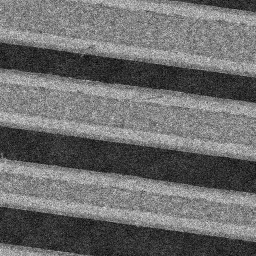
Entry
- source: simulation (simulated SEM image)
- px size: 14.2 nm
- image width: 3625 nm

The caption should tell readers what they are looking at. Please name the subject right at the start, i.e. one or a few lines or trenches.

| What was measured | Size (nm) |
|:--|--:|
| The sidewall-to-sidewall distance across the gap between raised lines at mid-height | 703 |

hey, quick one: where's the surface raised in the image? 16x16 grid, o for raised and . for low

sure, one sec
oooooooooo......
oooooooooooooooo
...ooooooooooooo
..........oooooo
................
ooooo...........
oooooooooooo....
.ooooooooooooooo
.........ooooooo
................
................
oooooooo........
.oooooooooooooo.
........oooooooo
................
................